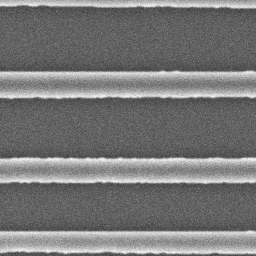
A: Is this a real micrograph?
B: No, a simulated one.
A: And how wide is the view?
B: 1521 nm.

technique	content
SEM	lines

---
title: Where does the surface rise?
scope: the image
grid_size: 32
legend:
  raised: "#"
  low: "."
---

################################
................................
................................
................................
................................
................................
................................
................................
................................
################################
################################
################################
................................
................................
................................
................................
................................
................................
................................
................................
################################
################################
################################
................................
................................
................................
................................
................................
................................
################################
################################
#..#.########.##################